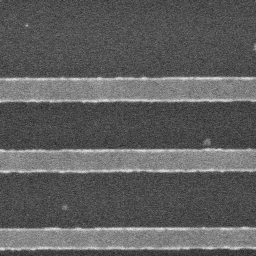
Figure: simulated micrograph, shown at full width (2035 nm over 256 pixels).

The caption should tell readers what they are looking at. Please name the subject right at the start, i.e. lines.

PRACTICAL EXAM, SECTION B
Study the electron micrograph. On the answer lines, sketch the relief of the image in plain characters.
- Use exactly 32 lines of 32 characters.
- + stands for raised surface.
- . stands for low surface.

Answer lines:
................................
................................
................................
................................
................................
................................
................................
................................
................................
................................
++++++++++++++++++++++++++++++++
++++++++++++++++++++++++++++++++
+++++++++++++++++++++++++++++..+
................................
................................
................................
................................
................................
................................
++++++++++++++++++++++++++++++++
++++++++++++++++++++++++++++++++
++++...+.++.....................
................................
................................
................................
................................
................................
................................
..............................+.
++++++++++++++++++++++++++++++++
++++++++++++++++++++++++++++++++
................................